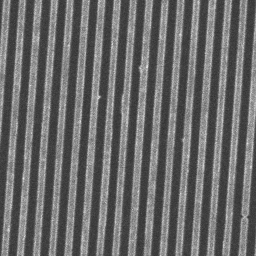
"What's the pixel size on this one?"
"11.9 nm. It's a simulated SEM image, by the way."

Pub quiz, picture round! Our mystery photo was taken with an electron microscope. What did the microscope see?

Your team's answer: parallel lines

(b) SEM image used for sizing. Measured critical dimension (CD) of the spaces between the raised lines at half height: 93.3 nm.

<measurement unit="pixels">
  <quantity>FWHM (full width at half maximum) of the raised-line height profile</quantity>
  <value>7.73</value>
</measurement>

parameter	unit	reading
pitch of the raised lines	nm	188